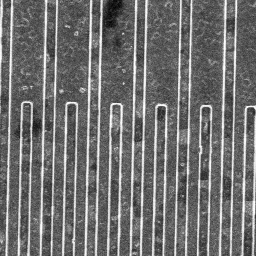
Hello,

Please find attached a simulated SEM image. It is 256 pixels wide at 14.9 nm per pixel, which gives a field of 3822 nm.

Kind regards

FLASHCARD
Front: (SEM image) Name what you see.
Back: parallel lines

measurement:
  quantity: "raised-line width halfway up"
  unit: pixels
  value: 10.8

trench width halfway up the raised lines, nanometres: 175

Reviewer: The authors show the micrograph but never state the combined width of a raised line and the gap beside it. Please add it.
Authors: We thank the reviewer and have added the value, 335 nm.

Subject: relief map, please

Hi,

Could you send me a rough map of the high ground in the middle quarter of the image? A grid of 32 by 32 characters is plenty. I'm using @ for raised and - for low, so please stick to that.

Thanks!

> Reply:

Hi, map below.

-------@@---------@@---------@@-
-------@@---------@@---------@@-
-------@@---------@@---------@@-
-------@@---------@@---------@@-
-------@@---------@@---------@@-
------@@@---------@@---------@@-
------@@@---------@@---------@@-
------@@@--------@@@---------@@-
------@@@---------@@---------@@-
------@@@---------@@---------@@-
-@@---@@@---@@----@@---@@----@@-
-@@---@@@---@@----@@---@@@---@@-
-@@---@@@---@@----@@---@@----@@-
-@@---@@@---@@----@@---@@----@@-
-@@---@@@---@@----@@---@@----@@-
-@@---@@@---@@----@@---@@----@@-
-@@---@@@---@@----@@---@@----@@-
-@@---@@@---@@---@@@---@@----@@-
-@@---@@@---@@---@@@---@@----@@-
-@@---@@@---@@---@@@---@@---@@@-
-@@---@@@---@@---@@@---@@---@@@-
@@@---@@@---@@---@@@---@@---@@@-
@@@---@@@---@@---@@@---@@---@@@-
@@@---@@@--@@@---@@@---@@---@@@-
@@@---@@@--@@@---@@@---@@---@@@-
@@@---@@@--@@@---@@@---@@---@@@-
@@@---@@---@@@---@@@---@@---@@@-
@@@---@@---@@@---@@@---@@---@@@-
@@@---@@---@@@---@@----@@---@@@-
@@@---@@---@@@---@@----@@---@@@-
@@@---@@---@@@---@@----@@---@@@-
@@@---@@---@@@---@@----@@---@@@-